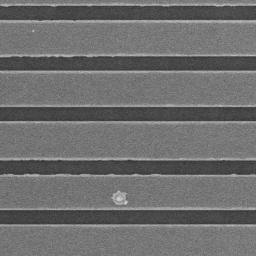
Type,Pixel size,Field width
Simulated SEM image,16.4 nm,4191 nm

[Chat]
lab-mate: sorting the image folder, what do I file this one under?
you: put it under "lines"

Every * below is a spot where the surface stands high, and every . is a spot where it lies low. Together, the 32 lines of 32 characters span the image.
********************************
................................
................................
********************************
********************************
********************************
********************************
................................
................................
********************************
********************************
********************************
********************************
................................
................................
********************************
********************************
********************************
********************************
********************************
................................
................................
********************************
********************************
********************************
********************************
................................
................................
********************************
********************************
********************************
********************************